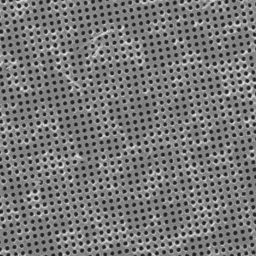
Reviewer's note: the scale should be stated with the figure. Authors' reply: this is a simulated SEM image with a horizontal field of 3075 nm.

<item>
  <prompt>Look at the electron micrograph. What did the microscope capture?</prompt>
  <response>a regular array of holes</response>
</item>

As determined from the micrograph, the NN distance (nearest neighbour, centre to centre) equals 84.9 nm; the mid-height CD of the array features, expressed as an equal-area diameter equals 50.7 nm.